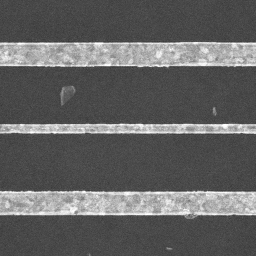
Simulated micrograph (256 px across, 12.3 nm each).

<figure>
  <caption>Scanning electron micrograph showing lines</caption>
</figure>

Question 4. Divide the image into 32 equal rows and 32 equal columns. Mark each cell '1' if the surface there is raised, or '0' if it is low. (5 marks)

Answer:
00000000000000000000000000000000
00000000000000000000000000000000
00000000000000000000000000000000
00000000000000000000000000000000
00000000000000000000000000000000
00000000000000010000001111111000
11111111111111111111111111111111
11111111111111111111111111111111
00000000000000000000000000000000
00000000000000000000000000000000
00000000000000000000000000000000
00000000100000000000000000000000
00000000000000000000000000000000
00000000000000000000000000000000
00000000000000000000000000000000
00000000000000000000000000000000
00000000000000000000000000000001
00000000000000000000000000000000
00000000000000000000000000000000
00000000000000000000000000000000
00000000000000000000000000000000
00000000000000000000000000000000
00000000000000000000000000000000
00000000000000000000000000000000
11111111111111111111111111111111
11111111111111111111111111111111
11111111111111111111111111111111
00000000000000000000000000000000
00000000000000000000000000000000
00000000000000000000000000000000
00000000000000000000000000000000
00000000000000000000000000000000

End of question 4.